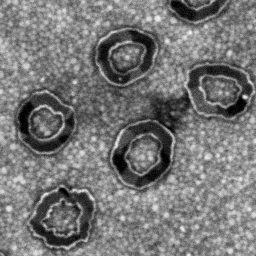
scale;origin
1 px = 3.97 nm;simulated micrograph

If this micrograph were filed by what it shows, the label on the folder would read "ring-shaped raised bodies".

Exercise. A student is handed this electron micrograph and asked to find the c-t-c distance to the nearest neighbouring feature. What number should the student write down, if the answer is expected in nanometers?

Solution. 395